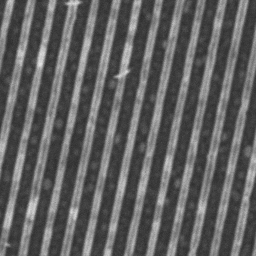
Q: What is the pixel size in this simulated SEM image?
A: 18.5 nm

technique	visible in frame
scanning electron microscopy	parallel lines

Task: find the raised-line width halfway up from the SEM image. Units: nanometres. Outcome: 109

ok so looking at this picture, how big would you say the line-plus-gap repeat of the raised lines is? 384 nm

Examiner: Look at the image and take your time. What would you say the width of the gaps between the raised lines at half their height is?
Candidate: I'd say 278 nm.